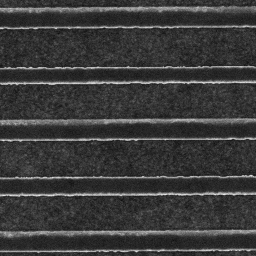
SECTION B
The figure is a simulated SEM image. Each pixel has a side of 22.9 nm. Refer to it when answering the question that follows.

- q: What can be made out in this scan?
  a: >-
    lines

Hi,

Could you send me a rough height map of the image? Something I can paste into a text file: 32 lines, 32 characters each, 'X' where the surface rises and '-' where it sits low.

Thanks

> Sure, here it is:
--------------------------------
XXXXXXXXXXXXXXXXXXXXXXXXXXXXXXXX
XXXXXXXXXXXXXXXXXXXXXXXXXXXXXXXX
XXXXX-XX------------------------
--------------------------------
--------------------------------
--------------------------------
--------------------------------
XXXXXXXXXXXXXXXXXXXXXXXXXXXXXXXX
XXXXXXXXXXXXXXXXXXXXXXXXXXXXXXXX
X-X---X-------------------------
--------------------------------
--------------------------------
--------------------------------
--------------------------------
XXXXXXXXXXXXXXXXXXXXXXXXXXXXXXXX
XXXXXXXXXXXXXXXXXXXXXXXXXXXXXXXX
XXX-X---------------------------
--------------------------------
--------------------------------
--------------------------------
--------------------------------
XXXXXXXXXXXXXXXXXXXXXXXXXXXXXXXX
XXXXXXXXXXXXXXXXXXXXXXXXXXXXXXXX
--------------------------------
--------------------------------
--------------------------------
--------------------------------
--------------------------------
XXXXXXXXXXXXXXXXXXXXXXXXXXXXXXXX
XXXXXXXXXXXXXXXXXXXXXXXXXXXXXXXX
----X---------------------------